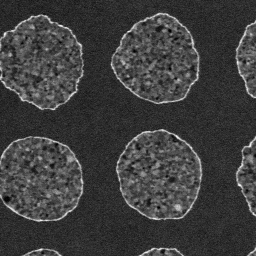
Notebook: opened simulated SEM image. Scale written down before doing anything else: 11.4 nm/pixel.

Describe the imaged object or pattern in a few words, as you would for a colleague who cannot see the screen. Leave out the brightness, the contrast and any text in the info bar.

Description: raised bodies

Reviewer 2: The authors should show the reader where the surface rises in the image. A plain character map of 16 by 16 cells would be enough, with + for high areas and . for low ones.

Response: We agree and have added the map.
................
.+++.....++.....
+++++...++++...+
+++++..+++++...+
+++++..+++++...+
.++++...++++...+
..++............
................
.........++.....
++++....++++...+
+++++..++++++..+
+++++..+++++...+
+++++...++++...+
.+++.....++.....
................
................